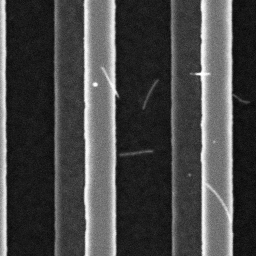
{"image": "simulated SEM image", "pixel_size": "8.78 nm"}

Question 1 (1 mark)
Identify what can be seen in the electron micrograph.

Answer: lines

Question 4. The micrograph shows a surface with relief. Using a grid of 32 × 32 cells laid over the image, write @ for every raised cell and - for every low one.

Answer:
@------@@@@@@@-------@@@@@@@@---
@------@@@@@@@-------@@@@@@@@---
@------@@@@@@@-------@@@@@@@@---
@------@@@@@@@-------@@@@@@@@---
@------@@@@@@@-------@@@@@@@@---
@------@@@@@@@--------@@@@@@@---
@------@@@@@@@--------@@@@@@@---
@------@@@@@@@--------@@@@@@@---
@------@@@@@@@--------@@@@@@@---
@------@@@@@@@--------@@@@@@@---
@------@@@@@@@--------@@@@@@@---
@------@@@@@@@--------@@@@@@@---
@------@@@@@@@--------@@@@@@@---
@------@@@@@@@-------@@@@@@@@---
@------@@@@@@@-------@@@@@@@@---
@------@@@@@@@-------@@@@@@@@---
@------@@@@@@@--------@@@@@@@---
@------@@@@@@@--------@@@@@@@---
@------@@@@@@@--------@@@@@@@---
@------@@@@@@@--------@@@@@@@---
@------@@@@@@@--------@@@@@@@---
@------@@@@@@@--------@@@@@@@---
@------@@@@@@@--------@@@@@@@---
@------@@@@@@@--------@@@@@@@---
@------@@@@@@@--------@@@@@@@---
@------@@@@@@@--------@@@@@@@---
@------@@@@@@@--------@@@@@@@---
@------@@@@@@@--------@@@@@@@---
@------@@@@@@@--------@@@@@@@---
@------@@@@@@@--------@@@@@@@---
@------@@@@@@@--------@@@@@@@---
@------@@@@@@@--------@@@@@@@---